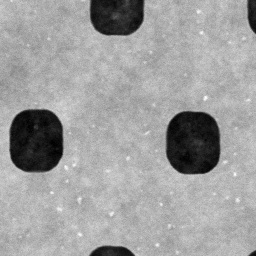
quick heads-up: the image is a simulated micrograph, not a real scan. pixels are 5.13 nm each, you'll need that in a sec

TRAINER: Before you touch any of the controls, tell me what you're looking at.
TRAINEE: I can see holes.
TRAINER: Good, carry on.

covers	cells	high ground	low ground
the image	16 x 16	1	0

1111110001111110
1111110001111111
1111111111111111
1111111111111111
1111111111111111
1111111111111111
1111111111111111
1000111111100111
1000111111000011
1000111111000011
1001111111100111
1111111111111111
1111111111111111
1111111111111111
1111111111111111
1111110011111111